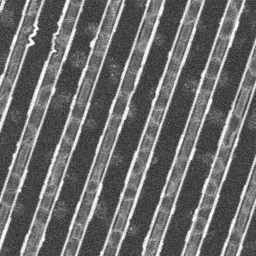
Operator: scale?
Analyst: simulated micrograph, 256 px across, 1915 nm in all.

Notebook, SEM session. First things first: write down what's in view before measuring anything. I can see parallel lines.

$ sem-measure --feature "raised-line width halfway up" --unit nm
182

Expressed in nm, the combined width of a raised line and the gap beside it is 284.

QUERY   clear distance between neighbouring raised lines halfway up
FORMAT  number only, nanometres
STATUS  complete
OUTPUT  98.2